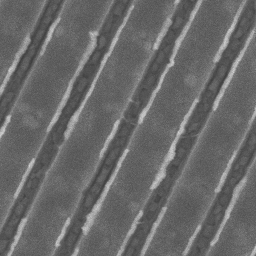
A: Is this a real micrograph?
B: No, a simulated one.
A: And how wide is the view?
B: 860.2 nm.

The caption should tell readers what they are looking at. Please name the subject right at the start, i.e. parallel lines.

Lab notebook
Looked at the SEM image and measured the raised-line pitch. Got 200 nanometres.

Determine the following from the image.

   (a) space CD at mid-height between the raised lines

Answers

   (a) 50.8 nm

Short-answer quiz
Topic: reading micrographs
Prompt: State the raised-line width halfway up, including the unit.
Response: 149 nanometers